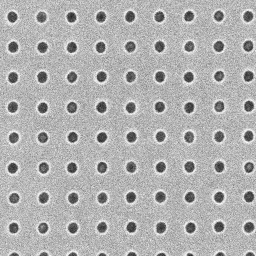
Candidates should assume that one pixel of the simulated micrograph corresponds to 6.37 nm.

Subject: a regular array of holes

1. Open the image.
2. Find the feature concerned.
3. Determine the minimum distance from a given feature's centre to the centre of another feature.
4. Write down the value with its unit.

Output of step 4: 0.186 um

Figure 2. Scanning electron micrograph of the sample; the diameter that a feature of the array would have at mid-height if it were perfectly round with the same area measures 71.7 nm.